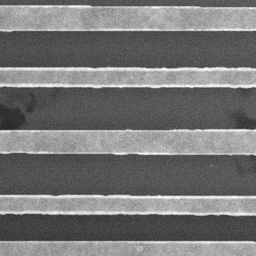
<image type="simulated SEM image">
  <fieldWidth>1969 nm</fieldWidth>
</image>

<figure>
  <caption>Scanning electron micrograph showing lines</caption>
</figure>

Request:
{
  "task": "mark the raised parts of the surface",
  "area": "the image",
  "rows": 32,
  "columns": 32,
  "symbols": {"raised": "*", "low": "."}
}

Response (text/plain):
................................
********************************
********************************
********************************
................................
................................
................................
................................
................................
********************************
********************************
................................
................................
................................
................................
................................
********************************
********************************
********************************
................................
................................
................................
................................
................................
*******.*****.**................
********************************
********************************
................................
................................
................................
********************************
********************************